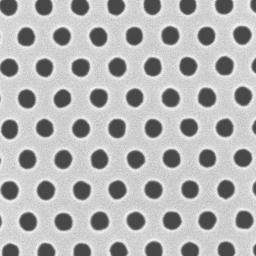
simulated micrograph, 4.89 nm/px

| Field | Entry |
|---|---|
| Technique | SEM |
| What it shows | a regular array of holes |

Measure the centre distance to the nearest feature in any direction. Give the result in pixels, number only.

35.3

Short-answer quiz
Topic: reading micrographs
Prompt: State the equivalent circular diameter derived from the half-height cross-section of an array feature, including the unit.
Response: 90 nanometres